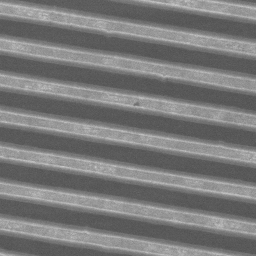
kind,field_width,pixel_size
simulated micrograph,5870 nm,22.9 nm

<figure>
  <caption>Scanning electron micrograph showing parallel lines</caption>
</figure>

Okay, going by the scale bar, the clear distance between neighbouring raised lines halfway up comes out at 481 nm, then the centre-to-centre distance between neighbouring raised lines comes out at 814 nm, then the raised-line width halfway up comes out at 334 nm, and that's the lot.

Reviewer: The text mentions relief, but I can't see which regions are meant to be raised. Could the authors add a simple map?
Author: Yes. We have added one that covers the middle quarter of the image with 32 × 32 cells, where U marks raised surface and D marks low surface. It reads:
DDDDDDDUUUUUUUUUUUUUUUUUUUUUUUDD
DDDDDDDDDDDDDDUUUUUUUUUUUUUUUUUU
DDDDDDDDDDDDDDDDDDDDUUUUUUUUUUUU
DDDDDDDDDDDDDDDDDDDDDDDDDUUUUUUU
DDDDDDDDDDDDDDDDDDDDDDDDDDDDDDDD
UUUDDDDDDDDDDDDDDDDDDDDDDDDDDDDD
UUUUUUUUUUUDDDDDDDDDDDDDDDDDDDDD
UUUUUUUUUUUUUUUUUDDDDDDDDDDDDDDD
DUUUUUUUUUUUUUUUUUUUUUUDDDDDDDDD
DDDDDDDUUUUUUUUUUUUUUUUUUUUUUDDD
DDDDDDDDDDDDDUUUUUUUUUUUUUUUUUUU
DDDDDDDDDDDDDDDDDDDDUUUUUUUUUUUU
DDDDDDDDDDDDDDDDDDDDDDDDDUUUUUUU
DDDDDDDDDDDDDDDDDDDDDDDDDDDDDDDU
UUUUDDDDDDDDDDDDDDDDDDDDDDDDDDDD
UUUUUUUUUUUDDDDDDDDDDDDDDDDDDDDD
UUUUUUUUUUUUUUUUUDDDDDDDDDDDDDDD
DUUUUUUUUUUUUUUUUUUUUUDDDDDDDDDD
DDDDDDDUUUUUUUUUUUUUUUUUUUUUDDDD
DDDDDDDDDDDDUUUUUUUUUUUUUUUUUUUU
DDDDDDDDDDDDDDDDDDDUUUUUUUUUUUUU
DDDDDDDDDDDDDDDDDDDDDDDDUUUUUUUU
DDDDDDDDDDDDDDDDDDDDDDDDDDDDDDDD
UUUUDDDDDDDDDDDDDDDDDDDDDDDDDDDD
UUUUUUUUUUDDDDDDDDDDDDDDDDDDDDDD
UUUUUUUUUUUUUUUDDDDDDDDDDDDDDDDD
DUUUUUUUUUUUUUUUUUUUUUUDDDDDDDDD
DDDDDDDUUUUUUUUUUUUUUUUUUUUUUDDD
DDDDDDDDDDDDUUUUUUUUUUUUUUUUUUUU
DDDDDDDDDDDDDDDDDDDUUUUUUUUUUUUU
DDDDDDDDDDDDDDDDDDDDDDDDDUUUUUUU
DDDDDDDDDDDDDDDDDDDDDDDDDDDDDDDD